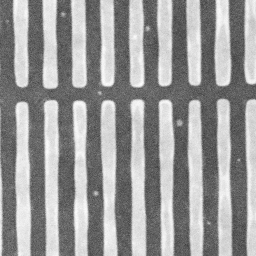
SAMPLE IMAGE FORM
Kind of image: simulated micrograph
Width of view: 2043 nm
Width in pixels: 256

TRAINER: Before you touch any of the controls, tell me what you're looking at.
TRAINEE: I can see groups of lines, slits or small figures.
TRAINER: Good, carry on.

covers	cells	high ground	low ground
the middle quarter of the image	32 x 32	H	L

LLHHHLLLLLHHLLLLLHHLLLLLHHHLLLLH
LLHHHLLLLLHHLLLLLHHHLLLLHHHLLLLH
LLHHHLLLLLHHLLLLLHHHLLLLHHHLLLLH
LLHHHLLLLLHHLLLLLHHHLLLLHHHLLLLH
LLHHHLLLLLHHLLLLLHHLLLLLHHHLLLLH
LLLHHLLLLLLLLLLLLLLLLLLLLLLLLLLL
LLLLLLLLLLLLLLLLLLLLLLLLLLLLLLLL
LLLLLLLLLLLLLLLLLLLLLLLLLLLLLLLL
LLLLLLLLLLLLLLLLLLLLLLLLLLLLLLLL
LLLLLLLLLLLLLLLLLLLLLLLLHHLLLLLL
LLLHHLLLLLHHLLLLLHHLLLLLHHHLLLLH
LLLHHLLLLLHHLLLLLHHLLLLLHHHLLLLH
LLLHHLLLLHHHHLLLLHHLLLLLHHHLLLLH
LLLHHHLLLHHHHLLLLHHHLLLLHHHLLLLH
LLLHHHLLLHHHHLLLLHHHLLLLHHHLLLLH
LLLHHLLLLHHHHLLLLHHHLLLLHHHLLLLL
LLLHHLLLLHHHHLLLLHHHLLLLHHHLLLLL
LLLHHLLLLHHHHLLLLHHHLLLLHHHLLLLH
LLLHHLLLLHHHHLLLLHHHLLLLHHHLLLLH
LLLHHLLLLHHHHLLLLHHHLLLLHHHLLLLH
LLLLHLLLLHHHHLLLLHHHLLLLHHHLLLLH
LLLHHLLLLLHHHLLLLHHHLLLLHHHLLLLH
LLLHHLLLLLHHHLLLLHHHLLLLHHHLLLLH
LLLHHLLLLLHHHLLLLHHHLLLLHHHLLLLH
LLLHHLLLLLHHHLLLLHHHLLLLHHHLLLLH
LLLHHLLLLLHHHLLLLHHHLLLLHHHLLLLL
LLLHHHLLLLHHHLLLLHHHLLLLHHHLLLLL
LLLHHHLLLLHHHLLLLHHHLLLLHHHLLLLL
LLLHHHLLLLHHHLLLLHHHLLLLHHHLLLLL
LLLHHHLLLLHHHLLLLHHHLLLLHHHLLLLL
LLLHHHLLLLHHHLLLLHHHLLLLHHHLLLLL
LLLHHHLLLLHHHLLLLHHHLLLLHHHLLLLL